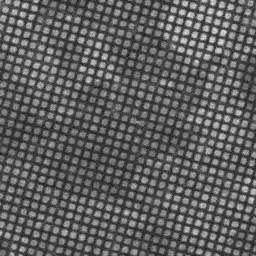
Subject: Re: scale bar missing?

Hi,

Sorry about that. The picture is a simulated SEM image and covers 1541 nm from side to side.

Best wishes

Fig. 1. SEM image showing a regular array of raised bodies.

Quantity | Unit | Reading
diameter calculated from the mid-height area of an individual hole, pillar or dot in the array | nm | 34.6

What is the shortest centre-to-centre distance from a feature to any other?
52.6 nanometers